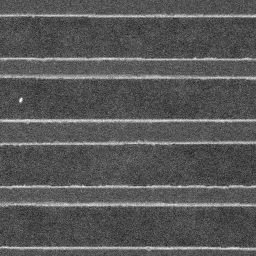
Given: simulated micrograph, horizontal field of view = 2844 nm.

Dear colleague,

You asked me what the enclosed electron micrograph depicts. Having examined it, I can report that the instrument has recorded lines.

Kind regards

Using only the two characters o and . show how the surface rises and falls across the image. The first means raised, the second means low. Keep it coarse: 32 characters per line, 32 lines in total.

oooooooooooooooooooooooooooooooo
oooooooooooooooooooooooooooooooo
................................
................................
................................
................................
................................
oooooooooooooooooooooooooooooooo
oooooooooooooooooooooooooooooooo
oooooooooooooooooooooooooooooooo
................................
................................
................................
................................
................................
oooooooooooooooooooooooooooooooo
oooooooooooooooooooooooooooooooo
oooooooooooooooooooooooooooooooo
................................
................................
................................
................................
................................
oooooooooooooooooooooooooooooooo
oooooooooooooooooooooooooooooooo
ooo.oooooooooooooooooooooooooooo
................................
................................
................................
................................
................................
oooooooooooooooooooooooooooooooo